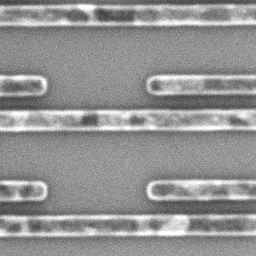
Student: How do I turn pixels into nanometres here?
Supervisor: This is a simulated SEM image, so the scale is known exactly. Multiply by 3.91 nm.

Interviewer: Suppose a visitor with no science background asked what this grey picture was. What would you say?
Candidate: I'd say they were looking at wiring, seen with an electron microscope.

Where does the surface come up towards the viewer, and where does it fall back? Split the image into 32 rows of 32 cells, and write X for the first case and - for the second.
--------------------------------
XXXXXXXXXXXXXXXXXXXXXXXXXXXXXXXX
XXXXXXXXXXXXXXXXXXXXXXXXXXXXXXXX
--------------------------------
--------------------------------
--------------------------------
--------------------------------
--------------------------------
--------------------------------
--------------------------------
XXXXXX------------XXXXXXXXXXXXXX
XXXXX--------------XXXXXXXXXXXXX
--------------------------------
--------------------------------
XXXXXXXXXXXXXXXXXXXXXXXXXXXXXXXX
XXXXXXXXXXXXXXXXXXXXXXXXXXXXXXXX
--------------------------------
--------------------------------
--------------------------------
--------------------------------
--------------------------------
--------------------------------
--------------------------------
XXXXXX-------------XXXXXXXXXXXXX
XXXXXX-------------XXXXXXXXXXXXX
--------------------------------
--------------------------------
XXXXXXXXXXXXXXXXXXXXXXXXXXXXXXXX
XXXXXXXXXXXXXXXXXXXXXXXXXXXXXXXX
--------------------------------
--------------------------------
--------------------------------